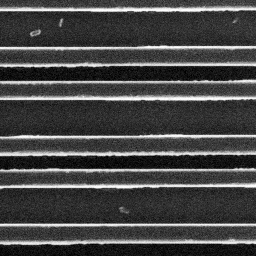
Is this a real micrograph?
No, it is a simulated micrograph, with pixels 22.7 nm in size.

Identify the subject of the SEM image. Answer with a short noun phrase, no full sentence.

lines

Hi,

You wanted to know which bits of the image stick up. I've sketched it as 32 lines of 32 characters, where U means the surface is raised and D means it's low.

UUUUUUUUUUUUUUUUUUUUUUUUUUUUUUUU
DDDDDDDDDDDDDDDDDDDDDDDDDDDDDDDD
DDDDDDDDDDDDDDDDDDDDDDDDDDDDDDDD
DDDDDDDDDDDDDDDDDDDDDDDDDDDDDDDD
DDDDDDDDDDDDDDDDDDDDDDDDDDDDDDDD
DDDDDDDDDDDDDDDDDDDDDDDDDDDDDDDD
UUUUUUUUUUUUUUUUUUUUUUUUUUUUUUUU
UUUUUUUUUUUUUUUUUUUUUUUUUUUUUUUU
DDDDDDDDDDDDDDDDDDDDDDDDDDDDDDDD
DDDDDDDDDDDDDDDDDDDDDDDDDDDDDDDD
UUUUUUUUUUUUUUUUUUUUUUUUUUUUUUUU
UUUUUUUUUUUUUUUUUUUUUUUUUUUUUUUU
DDDDDDDDDDDDDDDDDDDDDDDDDDDDDDDD
DDDDDDDDDDDDDDDDDDDDDDDDDDDDDDDD
DDDDDDDDDDDDDDDDDDDDDDDDDDDDDDDD
DDDDDDDDDDDDDDDDDDDDDDDDDDDDDDDD
DDDDDDDDDDDDDDDDDDDDDDDDDDDDDDDD
UUUUUUUUUUUUUUUUUUUUUUUUUUUUUUUU
UUUUUUUUUUUUUUUUUUUUUUUUUUUUUUUU
DDDDDDDDDDDDDDDDDDDDDDDDDDDDDDDD
DDDDDDDDDDDDDDDDDDDDDDDDDDDDDDDD
UUUUUUUUUUUUUUUUUUUUUUUUUUUUUUUU
UUUUUUUUUUUUUUUUUUUUUUUUUUUUUUUU
DDDDDDDDDDDDDDDDDDDDDDDDDDDDDDDD
DDDDDDDDDDDDDDDDDDDDDDDDDDDDDDDD
DDDDDDDDDDDDDDDDDDDDDDDDDDDDDDDD
DDDDDDDDDDDDDDDDDDDDDDDDDDDDDDDD
DDDDDDDDDDDDDDDDDDDDDDDDDDDDDDDD
UUUUUUUUUUUUUUUUUUUUUUUUUUUUUUUU
UUUUUUUUUUUUUUUUUUUUUUUUUUUUUUUU
DDDDDDDDDDDDDDDDDDDDDDDDDDDDDDDD
DDDDDDDDDDDDDDDDDDDDDDDDDDDDDDDD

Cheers